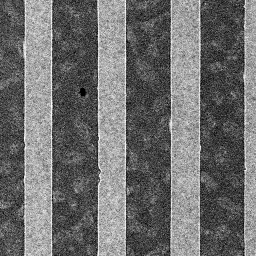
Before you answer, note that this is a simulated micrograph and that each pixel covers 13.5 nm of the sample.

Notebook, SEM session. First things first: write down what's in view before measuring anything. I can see one or a few lines or trenches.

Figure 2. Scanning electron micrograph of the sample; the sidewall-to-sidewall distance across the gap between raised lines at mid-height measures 612 nanometres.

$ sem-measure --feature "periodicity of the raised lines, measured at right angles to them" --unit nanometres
991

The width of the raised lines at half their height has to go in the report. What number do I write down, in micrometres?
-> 0.367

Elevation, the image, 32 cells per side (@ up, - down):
---@@@------@@@@-----@@@@------@
---@@@------@@@@-----@@@@------@
---@@@------@@@@-----@@@@------@
---@@@------@@@@-----@@@@------@
---@@@------@@@@@----@@@@------@
---@@@------@@@@-----@@@@------@
---@@@------@@@@-----@@@@------@
---@@@------@@@@-----@@@@------@
---@@@------@@@@-----@@@@------@
---@@@------@@@@-----@@@@------@
---@@@------@@@@-----@@@@------@
---@@@------@@@@-----@@@@------@
---@@@------@@@@-----@@@@------@
---@@@------@@@@-----@@@@------@
---@@@------@@@@-----@@@@------@
---@@@------@@@@-----@@@@------@
---@@@------@@@@-----@@@@------@
---@@@------@@@@-----@@@@------@
---@@@------@@@@-----@@@@------@
---@@@------@@@@-----@@@@------@
---@@@------@@@@-----@@@@------@
---@@@-------@@@-----@@@@------@
---@@@-------@@@-----@@@@@-----@
---@@@------@@@@-----@@@@------@
---@@@@-----@@@@-----@@@@------@
---@@@@-----@@@@-----@@@@------@
---@@@------@@@@-----@@@@------@
---@@@------@@@@-----@@@@------@
---@@@------@@@@-----@@@@------@
---@@@------@@@@-----@@@@------@
---@@@------@@@@-----@@@@------@
---@@@------@@@@-----@@@@------@